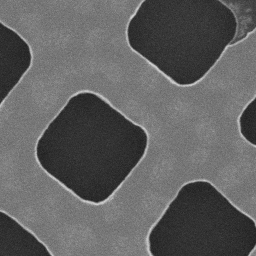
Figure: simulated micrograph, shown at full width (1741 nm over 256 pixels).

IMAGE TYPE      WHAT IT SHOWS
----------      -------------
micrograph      holes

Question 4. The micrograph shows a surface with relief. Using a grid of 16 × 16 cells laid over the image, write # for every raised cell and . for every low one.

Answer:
#########.......
########........
.#######.......#
..#######.....##
..########...###
.###############
####...#########
###.....#######.
###......######.
##.......#######
###.....########
####....####.###
#####..####...##
.#########.....#
..#######.......
...######.......